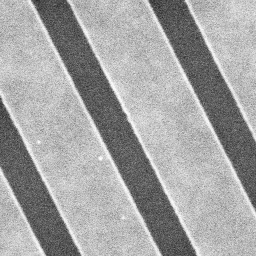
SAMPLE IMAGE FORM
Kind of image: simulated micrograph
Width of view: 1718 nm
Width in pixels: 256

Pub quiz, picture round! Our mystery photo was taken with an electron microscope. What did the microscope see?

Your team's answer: lines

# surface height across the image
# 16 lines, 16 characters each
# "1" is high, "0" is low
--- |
1100111110001111
1110011111001111
1110001111000111
1111001111100111
1111000111100011
1111100111110011
1111100011111001
0111110011111001
0111110001111100
0011111001111100
0011111000111110
1001111100111110
1001111100011111
1100111110011111
1100111110001111
1110011111001111